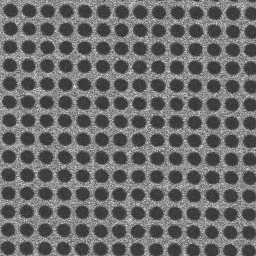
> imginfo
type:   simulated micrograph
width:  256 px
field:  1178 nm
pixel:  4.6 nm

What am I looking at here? a regular array of holes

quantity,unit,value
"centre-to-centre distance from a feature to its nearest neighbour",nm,83.7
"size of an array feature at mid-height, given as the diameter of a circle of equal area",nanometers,62.3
